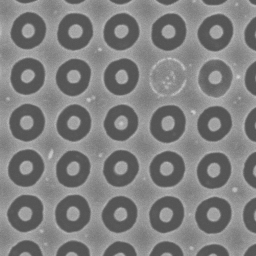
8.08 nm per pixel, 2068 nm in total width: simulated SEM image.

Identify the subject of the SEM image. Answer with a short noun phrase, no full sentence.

a regular array of ring-shaped grooves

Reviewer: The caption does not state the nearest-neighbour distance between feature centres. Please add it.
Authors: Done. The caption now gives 367 nm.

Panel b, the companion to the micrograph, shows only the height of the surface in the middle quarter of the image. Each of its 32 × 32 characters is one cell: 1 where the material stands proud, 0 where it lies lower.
00000011111000000011111111111111
00000001110000000001111111111111
01110001110001110001111111111111
01110001110001110001111111111111
01100011110001110011111111111111
00000011110000000011111111111111
00000111111000000111111111111111
00001111111100001111111111111111
11111111111111111111111111111111
11111111111111111111111111111111
10000111111110001111111100001111
00000011111000000011111000000111
00000011111000000011110000000011
00110001110001100001110001100011
01110001110001110001100001110001
01110001110001110001100001100011
00000001110000000011100001100011
00000011111000000111110000000011
00000111111100001111111000000111
11011111111111011111111100011111
11111111111111111111111111111111
10011111111111011111111111111111
00000111111100000111111100000111
00000011111000000011110000000011
00000001110000100001110000000011
01110001110001110001100011100011
01110001110001110001100011100011
01100011110000100011100001100011
00000011110000000011110000000011
00000111111000000111110000000111
00001111111100001111111000011111
11111111111111111111111111111111